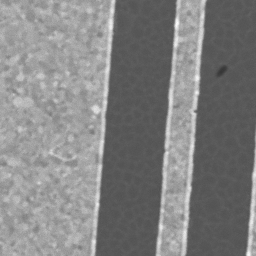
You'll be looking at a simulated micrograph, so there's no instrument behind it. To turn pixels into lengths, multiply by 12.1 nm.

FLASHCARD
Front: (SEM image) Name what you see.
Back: one or a few lines or trenches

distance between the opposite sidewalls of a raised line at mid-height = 0.295 microns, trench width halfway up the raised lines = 793 nanometres